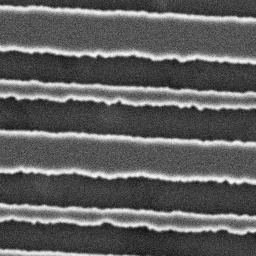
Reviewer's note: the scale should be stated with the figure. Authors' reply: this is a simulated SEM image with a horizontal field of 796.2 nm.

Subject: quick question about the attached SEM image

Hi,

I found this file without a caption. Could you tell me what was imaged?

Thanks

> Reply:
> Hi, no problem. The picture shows lines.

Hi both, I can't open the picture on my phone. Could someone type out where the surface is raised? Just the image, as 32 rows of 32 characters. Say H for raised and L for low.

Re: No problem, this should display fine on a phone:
LLLLLLLLLLLLLLLLLLLLLLLLLLLLLLLL
HHHHHHHHHHHHHHHHHHLLLLLLLLLLLLLL
HHHHHHHHHHHHHHHHHHHHHHHHHHHHHHHH
HHHHHHHHHHHHHHHHHHHHHHHHHHHHHHHH
HHHHHHHHHHHHHHHHHHHHHHHHHHHHHHHH
HHHHHHHHHHHHHHHHHHHHHHHHHHHHHHHH
LLLLLLHHHHHHHHHHHHHHHHHHHHHHHHHH
LLLLLLLLLLLLLLLLLLLLLLHHLLHHHHHH
LLLLLLLLLLLLLLLLLLLLLLLLLLLLLLLL
LLLLLLLLLLLLLLLLLLLLLLLLLLLLLLLL
HHHHHHHHLLLLLLLLLLLLLLLLLLLLLLLL
HHHHHHHHHHHHHHHHHHHHHHHHHHHLLLLL
LLLLLLLHLLHHHHHHHHHHHHHHHHHHHHHH
LLLLLLLLLLLLLLLLLLLLLLLLLHHHLHHH
LLLLLLLLLLLLLLLLLLLLLLLLLLLLLLLL
LLLLLLLLLLLLLLLLLLLLLLLLLLLLLLLL
HHHLHLLLLLLLLLLLLLLLLLLLLLLLLLLL
HHHHHHHHHHHHHHHHHHHHHHHLLLLLLLLL
HHHHHHHHHHHHHHHHHHHHHHHHHHHHHHHH
HHHHHHHHHHHHHHHHHHHHHHHHHHHHHHHH
HHHHHHHHHHHHHHHHHHHHHHHHHHHHHHHH
HHLHHHHHHHHHHHHHHHHHHHHHHHHHHHHH
LLLLLLLLLLLLLLLLLLLLLHHHHHHHHHHH
LLLLLLLLLLLLLLLLLLLLLLLLLLLLLLLL
LLLLLLLLLLLLLLLLLLLLLLLLLLLLLLLL
LLLLLLLLLLLLLLLLLLLLLLLLLLLLLLLL
HHHHHHHHHHHHHHHHHHHLLLLLLLLLLLLL
HLLHHHHHHHHHHHHHHHHHHHHHHHHHHHHH
LLLLLLLLLLLLLLLLLLLHHHHHHHHHHHHH
LLLLLLLLLLLLLLLLLLLLLLLLLLLLLLLL
LLLLLLLLLLLLLLLLLLLLLLLLLLLLLLLL
HHHHHHHLLLLLLLLLLLLLLLLLLLLLLLLL